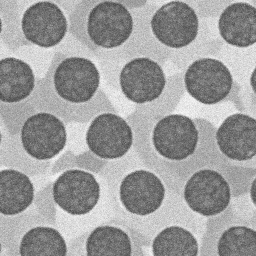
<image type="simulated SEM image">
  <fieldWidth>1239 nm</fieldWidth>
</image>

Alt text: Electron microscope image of a regular array of holes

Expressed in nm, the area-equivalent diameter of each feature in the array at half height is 227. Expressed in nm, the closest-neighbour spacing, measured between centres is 311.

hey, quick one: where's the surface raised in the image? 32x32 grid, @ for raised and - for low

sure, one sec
@@@@---@@@@@---@@@@@@--@@@@@@--@
@@@-----@@@-----@@@@----@@@@----
@@@-----@@@------@@------@@-----
@@@-----@@@------@@------@@-----
@@@-----@@@-----@@@------@@@----
@@@@---@@@@@---@@@@@----@@@@@---
@@@@@@@@@@@@@@@@@@@@@@@@@@@@@@@@
---@@@@@---@@@@@---@@@@@@--@@@@@
----@@@-----@@@-----@@@@----@@@@
----@@@-----@@@------@@------@@-
----@@@-----@@@------@@------@@-
----@@@-----@@@-----@@@------@@@
---@@@@@---@@@@@---@@@@@@---@@@@
@@@@@@@@@@@@@@@@@@@@@@@@@@@@@@@@
@@@@---@@@@@---@@@@@@--@@@@@@--@
@@@-----@@@-----@@@@----@@@@----
@@@-----@@@------@@------@@-----
@@@-----@@@------@@------@@-----
@@@-----@@@-----@@@------@@-----
@@@@---@@@@@---@@@@@----@@@@----
@@@@@@@@@@@@@@@@@@@@@@@@@@@@@@@@
---@@@@@---@@@@@@--@@@@@---@@@@@
----@@@-----@@@-----@@@-----@@@@
----@@@------@@------@@------@@-
----@@@------@@-----@@@------@@-
----@@@-----@@@-----@@@------@@@
---@@@@@---@@@@@---@@@@@----@@@@
@@@@@@@@@@@@@@@@@@@@@@@@@@@@@@@@
@@@@---@@@@@---@@@@@@--@@@@@@--@
@@@-----@@@-----@@@-----@@@@----
@@@-----@@@-----@@@------@@-----
@@@-----@@@-----@@@------@@-----